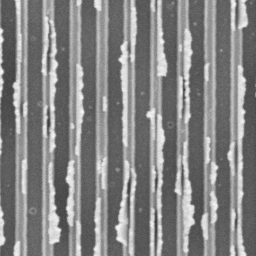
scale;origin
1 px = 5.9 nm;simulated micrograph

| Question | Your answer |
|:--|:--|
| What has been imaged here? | parallel lines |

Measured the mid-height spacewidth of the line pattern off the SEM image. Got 93 nm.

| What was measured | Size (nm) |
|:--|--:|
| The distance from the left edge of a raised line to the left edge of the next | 160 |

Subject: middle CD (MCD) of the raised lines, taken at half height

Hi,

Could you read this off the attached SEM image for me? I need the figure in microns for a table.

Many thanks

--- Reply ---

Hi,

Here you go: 0.0642